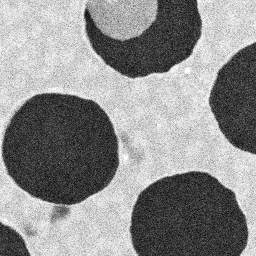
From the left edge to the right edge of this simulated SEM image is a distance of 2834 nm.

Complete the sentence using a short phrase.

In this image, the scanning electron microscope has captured holes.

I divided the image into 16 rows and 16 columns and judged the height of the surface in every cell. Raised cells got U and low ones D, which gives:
UUUUUDDDDDDDUUUU
UUUUUDDDDDDDDUUU
UUUUUDDDDDDDUUUU
UUUUUUDDDDDDUUDD
UUUUUUUDDDUUUUDD
UUUUUUUUUUUUUDDD
UDDDDDUUUUUUUDDD
DDDDDDDUUUUUUDDD
DDDDDDDUUUUUUUDD
DDDDDDDUUUUUUUUD
DDDDDDDUUUUUUUUU
UDDDDDDUUDDDDDUU
UUUDDUUUUDDDDDDU
UUUUUUUUDDDDDDDU
DUUUUUUUDDDDDDDD
DDUUUUUUDDDDDDDU